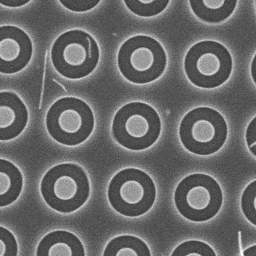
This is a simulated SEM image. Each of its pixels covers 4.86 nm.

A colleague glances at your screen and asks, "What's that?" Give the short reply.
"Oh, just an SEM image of an array of small figures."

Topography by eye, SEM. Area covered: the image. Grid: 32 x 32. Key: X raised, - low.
---XXXXX----XXXX-----XXX------XX
XXXXXXXXXXXXXXXXX---XXXX-----XXX
XXXXXXXXXXXXXXXXXXXXXXXXX---XXXX
--XXXXXXXXXXXXXXXXXXXXXXXXXXXXXX
----XXX----XXXXXX-XXXXXXXXXXXXXX
----XXX-----XXX-----XXXX----XXXX
----XX------XXX------XX------XXX
----XX------XXX------XX------XXX
---XXXX-----XXX------XX------XX-
XXXXXXXX---XXXX-----XXX------XX-
XXXXXXXXXXXXXXXXX-XXXXXX----XXXX
-XXXXXXXXXXXXXXXXXXXXXXXXXXXXXXX
---XXXX---XXXXXXXXXXXXXXXXXXXXXX
---XXX-----XXXX----XXXXXX-XXXXXX
----XX------XX------XXX-----XXXX
---XXX------XX------XXX-----XXX-
---XXX-----XXX------XX------XXX-
-XXXXXX----XXX------XXX-----XXX-
XXXXXXXXXXXXXXXX--XXXXX-----XXX-
XXXXXXXXXXXXXXXXXXXXXXXXXXXXXXXX
--XXXXXX-XXXXXXXXXXXXXXXXXXXXXXX
---XXX-----XXXX---XXXXXXXXXXXXXX
---XX------XXX-----XXXX----XXXXX
---XX------XXX-----XXX------XXX-
--XXX------XXX-----XXX------XX--
-XXXXX----XXXX-----XXX------XX--
XXXXXXX--XXXXXX---XXXX-----XXX--
XXXXXXXXXXXXXXXXXXXXXXXX--XXXXX-
-XXXXXXXXXXXXXXXXXXXXXXXXXXXXXXX
--XXXX---XXXXXX-XXXXXXXXXXXXXXXX
--XXX-----XXX-----XXXXX---XXXXXX
--XXX------XX------XXX-----XXX--